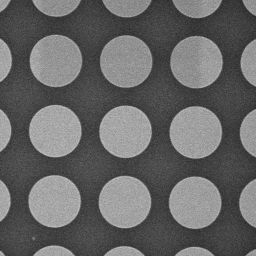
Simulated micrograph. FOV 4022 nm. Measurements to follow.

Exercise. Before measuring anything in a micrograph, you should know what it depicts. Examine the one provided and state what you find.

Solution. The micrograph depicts an array of small figures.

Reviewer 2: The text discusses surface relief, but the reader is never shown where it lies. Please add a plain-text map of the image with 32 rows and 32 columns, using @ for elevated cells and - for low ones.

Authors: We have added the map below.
@---@@@@@@---@@@@@@---@@@@@----@
-----@@@@-----@@@@-----@@@@----@
--------------------------------
--------------------------------
------@@------------------------
@----@@@@----@@@@@----@@@@@----@
@---@@@@@@---@@@@@@---@@@@@@--@@
@---@@@@@@---@@@@@@--@@@@@@@--@@
@---@@@@@@---@@@@@@--@@@@@@@--@@
@---@@@@@@---@@@@@----@@@@@----@
------@@------@@@------@@@------
--------------------------------
--------------------------------
------@@------@@@------@@@------
@---@@@@@@---@@@@@----@@@@@----@
@---@@@@@@---@@@@@@--@@@@@@@--@@
@---@@@@@@---@@@@@@--@@@@@@@--@@
@---@@@@@@---@@@@@@--@@@@@@@--@@
@---@@@@@----@@@@@----@@@@@----@
------@@-------@@------@@@------
--------------------------------
--------------------------------
-----@@@@-----@@@------@@@------
@---@@@@@@---@@@@@----@@@@@----@
@---@@@@@@--@@@@@@@--@@@@@@@--@@
@---@@@@@@--@@@@@@@--@@@@@@@--@@
@---@@@@@@---@@@@@@--@@@@@@---@@
-----@@@@----@@@@@----@@@@@----@
--------------------------------
--------------------------------
--------------------------------
-----@@@@-----@@@-----@@@@-----@